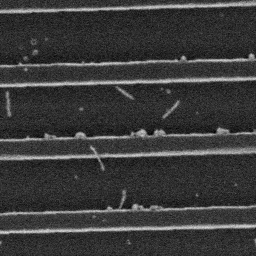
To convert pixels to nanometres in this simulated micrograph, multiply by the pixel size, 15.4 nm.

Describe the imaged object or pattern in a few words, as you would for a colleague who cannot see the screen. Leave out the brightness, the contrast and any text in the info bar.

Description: lines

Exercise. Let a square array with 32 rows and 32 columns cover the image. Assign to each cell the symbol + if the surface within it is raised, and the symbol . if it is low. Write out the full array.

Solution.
+++++++++++++++++++++++++++++++.
................................
................................
................................
................................
................................
................................
......................+........+
++++++++++++++++++++++++++++++++
++++++++++++++++++++++++++++++++
+++++++++.......................
................................
................................
................................
................................
................................
.................+.........++...
++++++++++++++++++++++++++++++++
++++++++++++++++++++++++++++++++
++++++++++++++..................
................................
................................
................................
................................
................................
................................
.......+++++++++++++++++++++++++
++++++++++++++++++++++++++++++++
++++++++++++++++++++++..........
................................
................................
................................